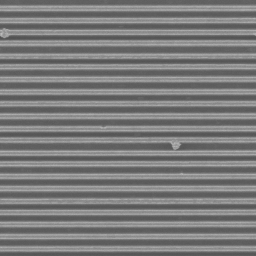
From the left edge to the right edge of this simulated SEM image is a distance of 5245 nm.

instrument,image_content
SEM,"parallel lines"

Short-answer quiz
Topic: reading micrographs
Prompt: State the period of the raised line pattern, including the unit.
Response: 247 nm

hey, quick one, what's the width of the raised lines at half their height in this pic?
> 102 nm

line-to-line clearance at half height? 0.141 µm